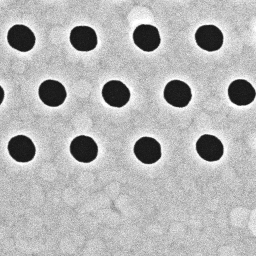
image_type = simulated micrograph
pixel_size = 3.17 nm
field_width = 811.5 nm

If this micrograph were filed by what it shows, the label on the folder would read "a regular array of holes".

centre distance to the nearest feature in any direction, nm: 197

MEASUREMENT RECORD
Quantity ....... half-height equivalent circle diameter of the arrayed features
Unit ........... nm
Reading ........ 88.4